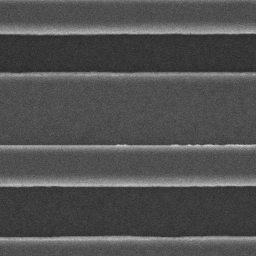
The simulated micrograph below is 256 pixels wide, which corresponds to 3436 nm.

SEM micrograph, lines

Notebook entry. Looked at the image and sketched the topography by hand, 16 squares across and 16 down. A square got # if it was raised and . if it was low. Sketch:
################
################
................
................
................
################
################
################
################
################
################
################
................
................
................
################